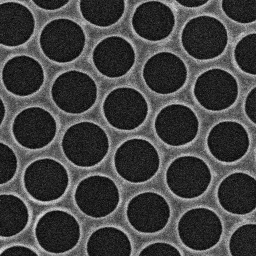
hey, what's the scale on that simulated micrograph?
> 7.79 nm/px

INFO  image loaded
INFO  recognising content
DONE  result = a regular array of holes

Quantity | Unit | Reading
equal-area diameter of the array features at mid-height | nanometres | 340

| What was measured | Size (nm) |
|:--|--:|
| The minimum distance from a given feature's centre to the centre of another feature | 414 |